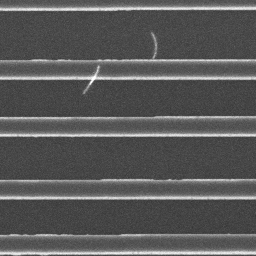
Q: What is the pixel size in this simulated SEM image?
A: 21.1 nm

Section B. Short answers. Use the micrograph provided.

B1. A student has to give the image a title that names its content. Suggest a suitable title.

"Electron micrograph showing lines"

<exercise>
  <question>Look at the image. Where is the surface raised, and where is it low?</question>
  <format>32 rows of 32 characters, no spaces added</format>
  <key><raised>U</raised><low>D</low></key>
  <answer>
UUUUUUUUUUUUUUUUUUUUUUUUUUUUUUUU
DDDDDDDDDDDDDDDDDDDDDDDDDDDDDDDD
DDDDDDDDDDDDDDDDDDDDDDDDDDDDDDDD
DDDDDDDDDDDDDDDDDDDDDDDDDDDDDDDD
DDDDDDDDDDDDDDDDDDDDDDDDDDDDDDDD
DDDDDDDDDDDDDDDDDDDDDDDDDDDDDDDD
DDDDDDDDDDDDDDDDDDDDDDDDDDDDDDDD
DDDDDDDDDDDDDDDDDDDDDDDDDDDDDDDD
UUUUUUUUUUUUUUUUUUUUUUUUUUUUUUUU
UUUUUUUUUUUUUUUUUUUUUUUUUUUUUUUU
DDDDDDDDDDDDDDDDDDDDDDDDDDDDDDDD
DDDDDDDDDDDDDDDDDDDDDDDDDDDDDDDD
DDDDDDDDDDDDDDDDDDDDDDDDDDDDDDDD
DDDDDDDDDDDDDDDDDDDDDDDDDDDDDDDD
DDDDDDDDDDDDDDDDDDDDDDDDDDDDDDDD
UUUUUUUUUUUUUUUUUUUUUUUUUUUUUUUU
UUUUUUUUUUUUUUUUUUUUUUUUUUUUUUUU
DDDDDDDDDDDDDDDDDDDDDDDDDDDDDDDD
DDDDDDDDDDDDDDDDDDDDDDDDDDDDDDDD
DDDDDDDDDDDDDDDDDDDDDDDDDDDDDDDD
DDDDDDDDDDDDDDDDDDDDDDDDDDDDDDDD
DDDDDDDDDDDDDDDDDDDDDDDDDDDDDDDD
DDDDDDDDDDDDDUUUUUUDDDDUUUUUUUUU
UUUUUUUUUUUUUUUUUUUUUUUUUUUUUUUU
UUUUUUUUUUUUUUUUUUUUUUUUUUUUUUUU
DDDDDDDDDDDDDDDDDDDDDDDDDDDDDDDD
DDDDDDDDDDDDDDDDDDDDDDDDDDDDDDDD
DDDDDDDDDDDDDDDDDDDDDDDDDDDDDDDD
DDDDDDDDDDDDDDDDDDDDDDDDDDDDDDDD
UUUUUUUUUUUUUUUUUUUUUUUUUUUUUUUU
UUUUUUUUUUUUUUUUUUUUUUUUUUUUUUUU
UUUUUUUUUUUUUUUUUUUUUUUUUUUUUUUU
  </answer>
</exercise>